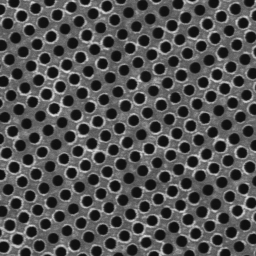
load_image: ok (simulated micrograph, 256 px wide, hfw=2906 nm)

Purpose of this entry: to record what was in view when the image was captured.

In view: a regular array of holes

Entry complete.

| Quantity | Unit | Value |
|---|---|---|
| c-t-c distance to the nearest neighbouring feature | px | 15.8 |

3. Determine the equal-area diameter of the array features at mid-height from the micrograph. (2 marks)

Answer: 128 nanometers